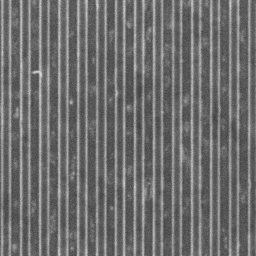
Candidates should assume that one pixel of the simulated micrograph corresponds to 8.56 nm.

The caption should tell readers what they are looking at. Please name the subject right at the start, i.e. parallel lines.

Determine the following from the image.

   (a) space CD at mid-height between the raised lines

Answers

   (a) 10 px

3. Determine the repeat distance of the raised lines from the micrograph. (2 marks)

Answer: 0.163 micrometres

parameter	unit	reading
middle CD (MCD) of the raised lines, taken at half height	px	9